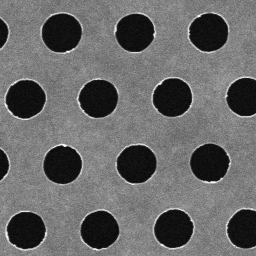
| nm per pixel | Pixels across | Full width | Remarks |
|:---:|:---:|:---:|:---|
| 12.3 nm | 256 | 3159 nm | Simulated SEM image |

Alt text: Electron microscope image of a regular array of holes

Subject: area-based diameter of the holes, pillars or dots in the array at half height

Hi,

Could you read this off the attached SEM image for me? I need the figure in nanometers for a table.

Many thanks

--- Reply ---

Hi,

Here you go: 474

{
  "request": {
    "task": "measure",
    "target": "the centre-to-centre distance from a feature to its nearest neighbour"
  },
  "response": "907 nanometers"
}